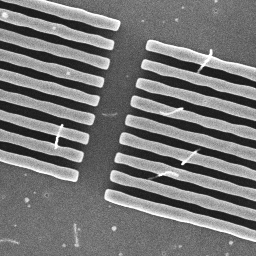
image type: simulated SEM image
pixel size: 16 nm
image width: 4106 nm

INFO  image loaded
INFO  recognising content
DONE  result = groups of lines, slits or small figures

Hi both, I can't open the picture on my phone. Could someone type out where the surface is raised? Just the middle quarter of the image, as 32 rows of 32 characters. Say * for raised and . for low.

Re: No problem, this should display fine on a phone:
.......****........*******......
***..................*********..
******..................********
**********..................****
....******........*****........*
........*.........*********.....
***.................**********..
******..................********
*********........***........****
....****.........******........*
.................*********......
**..................**********..
*******................*********
********........****........****
...****.........*******.........
................***********.....
***.................**********..
******.........*........********
******........*****.........****
...***........*********.......**
.................**********.....
***.................**********..
*****........**........*********
*****........******........*****
.............***********.....***
................***********.....
**..................**********..
****........***........*********
***.........******.........*****
.............**********........*
................**********......
...........*........**********..